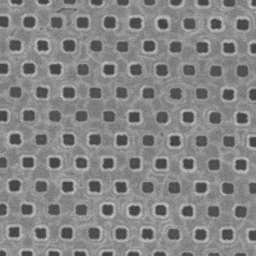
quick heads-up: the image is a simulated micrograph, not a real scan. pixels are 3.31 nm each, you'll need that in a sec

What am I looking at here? a regular array of holes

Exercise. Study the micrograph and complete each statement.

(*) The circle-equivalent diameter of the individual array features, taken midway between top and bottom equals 41.8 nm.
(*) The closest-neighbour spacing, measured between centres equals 86.3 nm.